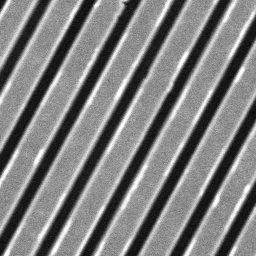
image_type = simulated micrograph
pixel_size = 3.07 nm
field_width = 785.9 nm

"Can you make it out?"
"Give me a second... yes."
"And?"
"parallel lines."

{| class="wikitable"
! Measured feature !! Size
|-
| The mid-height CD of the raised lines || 0.0812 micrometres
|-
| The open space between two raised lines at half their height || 12.7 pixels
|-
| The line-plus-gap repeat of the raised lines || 0.122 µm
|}